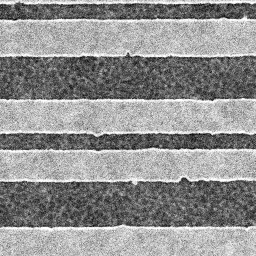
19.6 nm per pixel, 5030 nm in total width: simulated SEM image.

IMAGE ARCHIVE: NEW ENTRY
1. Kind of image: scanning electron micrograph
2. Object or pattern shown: one or a few lines or trenches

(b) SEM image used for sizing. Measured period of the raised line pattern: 1250 nm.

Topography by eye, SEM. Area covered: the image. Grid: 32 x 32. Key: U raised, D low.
DDDDDDDDDDDDDDDDDUDDDDDDDDDDDDDD
DDDDDDDDDDDDDDDDDDDDUDDDDDDDDDDD
DDDDDDDDDUUUDDDDDDDUUUUUUDUUUDUD
UUUUUUUUUUUUUUUUUUUUUUUUUUUUUUUU
UUUUUUUUUUUUUUUUUUUUUUUUUUUUUUUU
UUUUUUUUUUUUUUUUUUUUUUUUUUUUUUUU
UUUUUUUUUUUUUUUUUUUUUUUUUUUUUUUU
DDDDDDDDDDDDDDDDDDDDDDDDDDDDDDDD
DDDDDDDDDDDDDDDDDDDDDDDDDDDUDDDD
DDDDDDDDDDDDDDDDDDDDDDDDDDDDDDDD
DDDDDDDDDDDDDDDDDDDDDDDDDDDDDDDD
DDDDDDDDDDDDDDDDDDDDDDDDDDDDDDDD
DDDUDDDDDDUDDDDDDDDDDDDDDDDUUUUU
UUUUUUUUUUUUUUUUUUUUUUUUUUUUUUUU
UUUUUUUUUUUUUUUUUUUUUUUUUUUUUUUU
UUUUUUUUUUUUUUUUUUUUUUUUUUUUUUUU
UUDDUUUUUUUUUUUUUUUUUUUUUUUUUUUU
DDDDDDDDDDDDDDDDDDDDDDDDDDDDDDDD
DDDDDDDDDDDDDDDDDDDDDDDDDDDDDDDD
UUUUUUUUUUUUUUUUUUUUUUUUUUUUUUUU
UUUUUUUUUUUUUUUUUUUUUUUUUUUUUUUU
UUUUUUUUUUUUUUUUUUUUUUUUUUUUUUUU
UUUUUUUUUUUUUUUUUUUUUUDDUDDUUDDU
DDDDDDDDDDDDDDDDDDDDDDDDDDDDDDDD
DDDDDDDDDDDDDDDDDDDDDDDDDDDDDDDD
DDDDDDDDDDDDDDDDDDDDDDDDDDDDDDDD
DDDDDDDDDDDDDDDDDDDDDDDDDDDDDDDD
DDDDDDDDDDDDDDDDDDDDDDDDDDDDDDDD
DDDDDDDUUUUUUUUUUUUUUDUUUUUUDUDU
UUUUUUUUUUUUUUUUUUUUUUUUUUUUUUUU
UUUUUUUUUUUUUUUUUUUUUUUUUUUUUUUU
UUUUUUUUUUUUUUUUUUUUUUUUUUUUUUUU